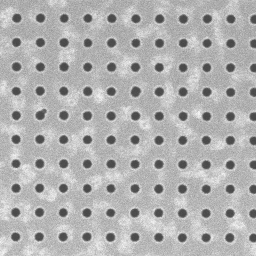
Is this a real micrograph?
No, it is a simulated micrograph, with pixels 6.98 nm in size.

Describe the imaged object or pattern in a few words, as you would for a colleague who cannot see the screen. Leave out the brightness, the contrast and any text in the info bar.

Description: a regular array of holes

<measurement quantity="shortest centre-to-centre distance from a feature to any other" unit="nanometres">165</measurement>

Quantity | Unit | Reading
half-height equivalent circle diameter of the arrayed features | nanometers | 64.3